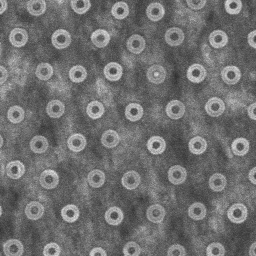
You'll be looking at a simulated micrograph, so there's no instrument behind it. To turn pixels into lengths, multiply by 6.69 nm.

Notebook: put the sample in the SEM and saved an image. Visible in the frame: a regular array of ring-shaped raised bodies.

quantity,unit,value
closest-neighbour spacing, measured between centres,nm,236